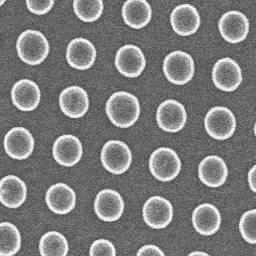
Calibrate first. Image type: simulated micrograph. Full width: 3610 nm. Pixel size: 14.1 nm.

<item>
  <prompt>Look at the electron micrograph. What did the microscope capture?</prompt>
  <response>a regular array of raised bodies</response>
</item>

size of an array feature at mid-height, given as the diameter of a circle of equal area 28.5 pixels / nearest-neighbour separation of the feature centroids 685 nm